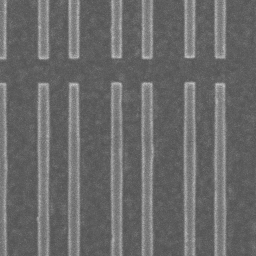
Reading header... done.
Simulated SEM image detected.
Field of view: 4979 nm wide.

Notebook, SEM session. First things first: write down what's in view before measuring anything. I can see parallel lines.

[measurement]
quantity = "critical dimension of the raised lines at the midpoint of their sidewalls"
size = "187 nm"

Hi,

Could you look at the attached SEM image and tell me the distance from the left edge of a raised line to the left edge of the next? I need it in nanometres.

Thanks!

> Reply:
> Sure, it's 687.